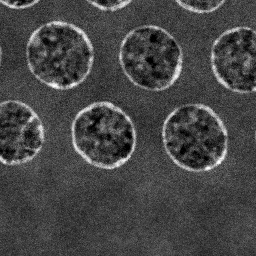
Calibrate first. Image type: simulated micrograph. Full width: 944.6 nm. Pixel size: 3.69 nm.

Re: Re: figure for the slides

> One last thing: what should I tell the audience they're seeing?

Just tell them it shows raised bodies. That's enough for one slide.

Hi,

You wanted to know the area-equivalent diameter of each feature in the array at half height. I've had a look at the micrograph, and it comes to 0.238 micrometres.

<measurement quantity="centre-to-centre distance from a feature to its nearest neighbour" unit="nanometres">336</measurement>